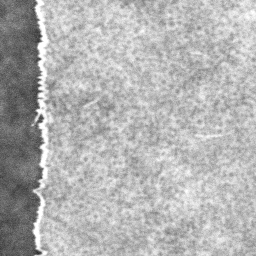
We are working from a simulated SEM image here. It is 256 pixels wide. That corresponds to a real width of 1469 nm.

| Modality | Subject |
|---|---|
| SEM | one or a few lines or trenches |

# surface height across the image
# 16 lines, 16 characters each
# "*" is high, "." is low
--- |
..**************
...*************
...*************
...*************
...*************
...*************
...*************
...*************
...*************
...*************
...*************
...*************
...*************
..**************
..**************
...*************